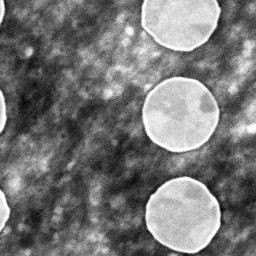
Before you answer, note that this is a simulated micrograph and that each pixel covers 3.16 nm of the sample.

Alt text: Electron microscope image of raised bodies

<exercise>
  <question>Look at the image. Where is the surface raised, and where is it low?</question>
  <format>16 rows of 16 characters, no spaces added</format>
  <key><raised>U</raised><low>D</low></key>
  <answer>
DDDDDDDDDUUUUUDD
DDDDDDDDDUUUUUDD
DDDDDDDDDDUUUDDD
DDDDDDDDDDDDDDDD
DDDDDDDDDDDDDDDD
DDDDDDDDDDUUUDDD
DDDDDDDDDUUUUUDD
DDDDDDDDDUUUUUDD
DDDDDDDDDUUUUDDD
DDDDDDDDDDDDDDDD
DDDDDDDDDDDDDDDD
DDDDDDDDDDUUUDDD
DDDDDDDDDUUUUDDD
DDDDDDDDDUUUUUDD
DDDDDDDDDUUUUDDD
DDDDDDDDDDDUUDDD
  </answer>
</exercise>